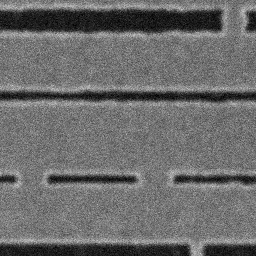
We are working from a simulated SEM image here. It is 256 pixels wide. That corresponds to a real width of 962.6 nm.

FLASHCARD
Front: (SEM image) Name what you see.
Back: one or a few lines or trenches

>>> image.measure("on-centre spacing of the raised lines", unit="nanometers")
285